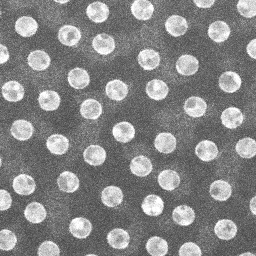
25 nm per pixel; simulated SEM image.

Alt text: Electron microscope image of a regular array of raised bodies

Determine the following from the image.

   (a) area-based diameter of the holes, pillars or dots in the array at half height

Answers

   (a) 0.505 micrometres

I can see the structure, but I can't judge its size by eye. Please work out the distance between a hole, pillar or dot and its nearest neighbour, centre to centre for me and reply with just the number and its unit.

0.918 micrometres